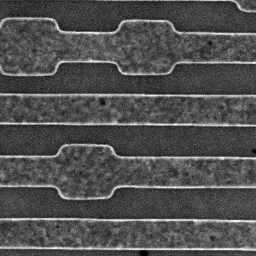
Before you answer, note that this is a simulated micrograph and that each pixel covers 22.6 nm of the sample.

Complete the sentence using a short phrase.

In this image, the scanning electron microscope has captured wiring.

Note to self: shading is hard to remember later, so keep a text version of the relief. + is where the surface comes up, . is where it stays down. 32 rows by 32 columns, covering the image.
..............................++
................................
+++++++.........................
+++++++........+++++++..........
++++++++++++++++++++++++++++++++
++++++++++++++++++++++++++++++++
++++++++++++++++++++++++++++++++
++++++++++++++++++++++++++++++++
+++++++........+++++++..........
................................
................................
................................
++++++++++++++++++++++++++++++++
++++++++++++++++++++++++++++++++
++++++++++++++++++++++++++++++++
........++++++++++++++++++++++++
................................
................................
........++++++..................
......+++++++++.................
++++++++++++++++++++++++++++++++
++++++++++++++++++++++++++++++++
++++++++++++++++++++++++++++++++
.......++++++++.................
........++++++..................
................................
................................
+++++++++++++...................
++++++++++++++++++++++++++++++++
++++++++++++++++++++++++++++++++
++++++++++++++++++++++++++++++++
................................